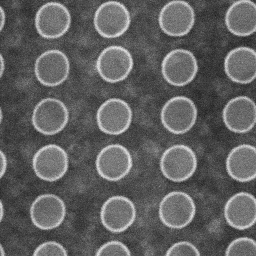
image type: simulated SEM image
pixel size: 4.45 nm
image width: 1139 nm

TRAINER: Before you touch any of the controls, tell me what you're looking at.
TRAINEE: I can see a regular array of raised bodies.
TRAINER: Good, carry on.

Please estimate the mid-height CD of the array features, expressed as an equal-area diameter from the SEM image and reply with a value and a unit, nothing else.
151 nanometres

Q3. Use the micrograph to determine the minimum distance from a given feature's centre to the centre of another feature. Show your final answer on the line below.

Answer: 0.208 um